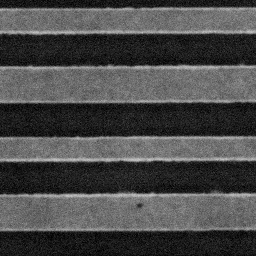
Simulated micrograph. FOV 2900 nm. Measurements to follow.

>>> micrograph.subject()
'lines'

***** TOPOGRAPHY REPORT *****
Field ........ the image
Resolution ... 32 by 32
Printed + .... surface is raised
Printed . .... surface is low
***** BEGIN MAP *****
................................
++++++++++++++++++++++++++++++++
++++++++++++++++++++++++++++++++
++++++++++++++++++++++++++++++++
................................
................................
................................
................................
++++++++++++++++++++++++++++++++
++++++++++++++++++++++++++++++++
++++++++++++++++++++++++++++++++
++++++++++++++++++++++++++++++++
++++++++++++++++++++++++++++++++
................................
................................
................................
................................
++++++++++++++++++++++++++++++++
++++++++++++++++++++++++++++++++
++++++++++++++++++++++++++++++++
................................
................................
................................
................................
++++++++++++++++++++++++++++++++
++++++++++++++++++++++++++++++++
++++++++++++++++++++++++++++++++
++++++++++++++++++++++++++++++++
++++++++++++++++++++++++++++++++
................................
................................
................................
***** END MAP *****